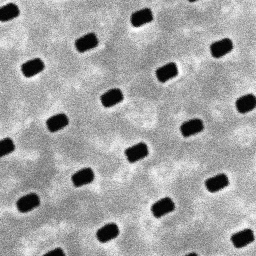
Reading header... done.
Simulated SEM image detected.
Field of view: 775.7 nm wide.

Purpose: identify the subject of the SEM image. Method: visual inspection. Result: a regular array of holes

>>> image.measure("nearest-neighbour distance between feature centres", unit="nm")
181